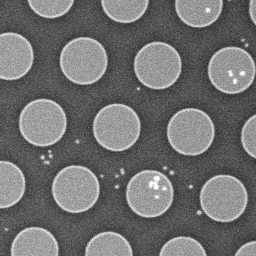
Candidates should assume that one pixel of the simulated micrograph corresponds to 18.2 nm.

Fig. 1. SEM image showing an array of small figures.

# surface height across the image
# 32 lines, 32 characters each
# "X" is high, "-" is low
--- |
----XXXXX----XXXXX----XXXXXX---X
-----XXX-----XXXXX----XXXXXX---X
--------------XXX------XXXX-----
--------------------------------
XXX-----------------------------
XXXX-----XXX-------XX-----------
XXXX----XXXXX----XXXXX-----XXXX-
XXXX----XXXXX----XXXXX----XXXXXX
XXXX----XXXXX----XXXXXX---XXXXXX
XXX-----XXXXX----XXXXX----XXXXXX
------------------XXX------XXXX-
----------------------------XX--
--------------------------------
---XXXXX-----XXX----------------
---XXXXX----XXXXX-----XXXX------
--XXXXXX----XXXXX----XXXXXX----X
---XXXXX----XXXXX----XXXXXX---XX
---XXXX-----XXXXX----XXXXXX---XX
-------------XXX------XXXX-----X
--------------------------------
X-------------------------------
XXX-----XXX-------XX------------
XXX----XXXXX----XXXXX-----XXXX--
XXX----XXXXX----XXXXX----XXXXXX-
XXX----XXXXX----XXXXXX---XXXXXX-
XX-----XXXXX----XXXXX----XXXXXX-
---------X-------XXX------XXXX--
---------------------------XX---
----X---------------------------
--XXXX------XXX-----------------
--XXXXX----XXXXX-----XXXX------X
-XXXXXX----XXXXX----XXXXXX----XX